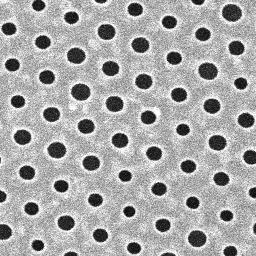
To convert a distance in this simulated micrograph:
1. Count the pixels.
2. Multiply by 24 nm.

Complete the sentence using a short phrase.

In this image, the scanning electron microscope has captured a regular array of holes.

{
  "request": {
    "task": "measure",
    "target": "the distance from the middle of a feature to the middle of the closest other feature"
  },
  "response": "0.858 microns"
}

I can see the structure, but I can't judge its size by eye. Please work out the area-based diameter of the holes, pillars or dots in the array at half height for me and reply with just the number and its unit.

378 nm